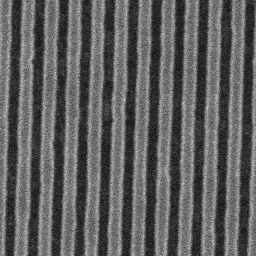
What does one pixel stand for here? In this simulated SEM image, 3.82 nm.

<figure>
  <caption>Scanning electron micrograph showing parallel lines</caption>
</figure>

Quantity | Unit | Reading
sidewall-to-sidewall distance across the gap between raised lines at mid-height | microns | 0.0444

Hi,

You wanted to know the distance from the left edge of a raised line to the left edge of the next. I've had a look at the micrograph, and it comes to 0.0892 micrometres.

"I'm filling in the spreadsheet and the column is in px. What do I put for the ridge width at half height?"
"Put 11.5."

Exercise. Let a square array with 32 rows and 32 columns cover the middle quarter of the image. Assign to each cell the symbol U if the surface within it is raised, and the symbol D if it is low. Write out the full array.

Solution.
DUUUDDDUUUDDDUUDDDDUUDDDUUUDDDUU
DUUUDDDUUUDDDUUUDDDUUDDDUUUDDDUU
DUUUDDDUUUDDDUUUDDUUUDDDUUUDDDUU
DUUUDDDUUUDDDUUUDDUUUDDDUUUDDDUU
DUUUDDDUUUDDDUUUDDUUUDDDUUUDDDUU
DUUUDDDUUDDDDUUDDDUUUDDDUUUDDDUU
DUUUDDDUUDDDDUUDDDUUUDDDUUUDDDUU
DUUUDDDUUDDDUUUDDDUUUDDDUUUDDDUU
DUUUDDDUUDDDUUUDDDUUUDDDUUUDDDUU
DUUUDDUUUDDDUUUDDDUUUDDDUUUDDDUU
DUUUDDUUUDDDUUUDDDUUUDDDUUUDDDUU
DUUUDDUUUDDDUUUDDDUUUDDDUUUDDDUU
DUUUDDUUUDDDUUUDDDUUUDDDUUUDDDUU
DUUUDDUUUDDDUUUDDDUUUDDDUUUDDDUU
DUUDDDUUUDDDUUUDDDUUUDDDUUUDDDUU
DUUDDDUUUDDDUUUDDDUUUDDDUUUDDDUU
DUUDDDUUUDDDUUUDDDUUUDDDUUUDDDUU
UUUDDDUUUDDDUUUDDDUUUDDDUUDDDDUU
UUUDDDUUUDDDUUUDDDUUUDDDUUDDDDUU
UUUDDDUUUDDDUUUDDDUUUDDDUUDDDDUU
DUUDDDUUUDDDUUUDDDUUUDDDUUDDDDUU
DUUDDDUUUDDDUUUDDDUUDDDUUUDDDUUU
DUUDDDUUUDDDUUUDDDUUDDDDUUDDDUUU
DUUDDDUUUDDDUUUDDDUUDDDDUUDDDUUU
UUUDDDUUUDDDUUUDDDUUDDDDUUDDDUUU
UUUDDDUUUDDDUUUDDDUUDDDDUUDDDUUU
UUUDDDUUUDDDUUUDDDUUDDDDUUDDDUUU
UUUDDDUUUDDDUUUDDDUUDDDDUUDDDDUU
UUUDDDUUUDDDUUUDDUUUDDDUUUDDDUUU
UUUDDDUUUDDDUUDDDUUUDDDUUUDDDUUU
UUUDDDUUUDDDUUUDDUUUDDDUUUDDDUUU
UUUDDDUUUDDDUUDDDUUUDDDUUUDDDUUU